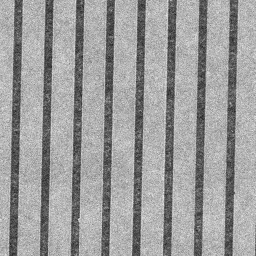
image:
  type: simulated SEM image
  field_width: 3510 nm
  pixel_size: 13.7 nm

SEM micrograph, parallel lines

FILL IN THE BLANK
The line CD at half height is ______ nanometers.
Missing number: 296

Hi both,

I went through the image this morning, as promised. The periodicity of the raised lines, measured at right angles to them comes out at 421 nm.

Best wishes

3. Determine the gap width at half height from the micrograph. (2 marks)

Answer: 0.125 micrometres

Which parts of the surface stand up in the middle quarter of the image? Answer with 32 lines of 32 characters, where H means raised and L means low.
HHHLLHHHHHLLLHHHHHLLHHHHHLLLHHHH
HHHLLHHHHHLLLHHHHHLLHHHHHHLLHHHH
HHLLLHHHHHLLLHHHHHLLHHHHHHLLHHHH
HHLLLHHHHHLLHHHHHHLLHHHHHLLLHHHH
HHLLLHHHHHLLHHHHHHLLHHHHHLLLHHHH
HHLLLHHHHHLLHHHHHHLLHHHHHLLLHHHH
HHLLLHHHHHLLHHHHHHLLHHHHHLLLHHHH
HHLLLHHHHHLLHHHHHHLLHHHHHLLLHHHH
HHLLLHHHHHLLHHHHHHLLHHHHHLLLHHHH
HHLLLHHHHHLLHHHHHHLLHHHHHLLLHHHH
HHLLLHHHHHLLHHHHHHLLHHHHHLLLHHHH
HHLLLHHHHHLLHHHHHHLLHHHHHLLLHHHH
HHLLLHHHHHLLHHHHHHLLHHHHHLLLHHHH
HHLLLHHHHHLLHHHHHHLLHHHHHLLLHHHH
HHLLLHHHHHLLHHHHHHLLHHHHHLLLHHHH
HHLLLHHHHHLLHHHHHHLLHHHHHLLLHHHH
HHLLLHHHHHLLHHHHHLLLHHHHHLLLHHHH
HHLLLHHHHHLLHHHHHLLLHHHHHLLLHHHH
HHLLLHHHHHLLHHHHHLLLHHHHHLLLHHHH
HHLLLHHHHHLLHHHHHLLLHHHHHLLLHHHH
HHLLLHHHHHLLHHHHHHLLHHHHHLLLHHHH
HHLLLHHHHHLLHHHHHLLLHHHHHLLLHHHH
HHLLLHHHHHLLHHHHHLLLHHHHHLLLHHHH
HHLLLHHHHHLLHHHHHLLLHHHHHLLHHHHH
HHLLLHHHHHLLHHHHHLLLHHHHHLLHHHHH
HHLLLHHHHLLLHHHHHLLLHHHHHLLHHHHH
HHLLHHHHHLLLHHHHHLLLHHHHHLLHHHHH
HHLLHHHHHLLLHHHHHLLLHHHHHLLHHHHH
HHLLHHHHHLLLHHHHHLLLHHHHHLHHHHHH
HHLLHHHHHLLLHHHHHLLLHHHHHLLHHHHH
HHLLHHHHHLLLHHHHHLLLHHHHHLLHHHHH
HHLLHHHHHLLLHHHHHLLLHHHHHLLHHHHH